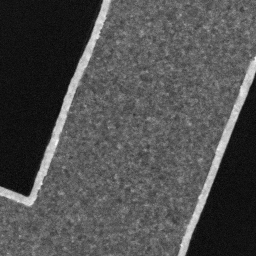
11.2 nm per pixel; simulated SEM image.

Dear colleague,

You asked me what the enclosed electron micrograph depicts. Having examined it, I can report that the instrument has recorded one or a few lines or trenches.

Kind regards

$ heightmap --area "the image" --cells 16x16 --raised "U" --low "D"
DDDDDDDUUUUUUUUU
DDDDDDUUUUUUUUUU
DDDDDDUUUUUUUUUU
DDDDDUUUUUUUUUUU
DDDDDUUUUUUUUUUU
DDDDDUUUUUUUUUUD
DDDDUUUUUUUUUUUD
DDDDUUUUUUUUUUUD
DDDDUUUUUUUUUUDD
DDDUUUUUUUUUUUDD
DDDUUUUUUUUUUDDD
DDUUUUUUUUUUUDDD
UDUUUUUUUUUUUDDD
UUUUUUUUUUUUDDDD
UUUUUUUUUUUUDDDD
UUUUUUUUUUUDDDDD